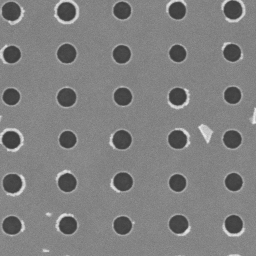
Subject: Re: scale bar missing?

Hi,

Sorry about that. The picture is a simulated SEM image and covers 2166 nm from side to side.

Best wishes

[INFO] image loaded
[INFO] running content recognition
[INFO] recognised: a regular array of holes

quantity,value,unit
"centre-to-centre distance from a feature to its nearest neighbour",359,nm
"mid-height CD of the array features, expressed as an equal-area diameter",159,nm